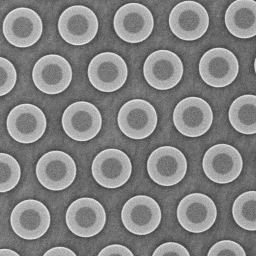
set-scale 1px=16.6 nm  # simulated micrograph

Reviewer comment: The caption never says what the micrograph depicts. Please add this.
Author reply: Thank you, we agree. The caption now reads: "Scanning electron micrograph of an array of small figures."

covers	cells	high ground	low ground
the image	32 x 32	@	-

----------------@-----@@@----@@@
-@@@----@@@@---@@@@--@@@@@--@@@@
-@@@@--@@@@@--@@@@@--@@@@@--@@@@
@@@@@--@@@@@--@@@@@--@@@@@--@@@@
-@@@@---@@@@---@@@@---@@@----@@@
--@@-----@----------------------
-------------------@@-----@@@---
@----@@@----@@@---@@@@---@@@@@--
@@--@@@@@--@@@@@--@@@@@--@@@@@--
@@--@@@@@--@@@@@--@@@@@--@@@@@--
@@--@@@@@---@@@----@@@----@@@---
@-----@@------------------------
-----------------@-----@@----@@@
--@@@---@@@@---@@@@---@@@@---@@@
-@@@@@--@@@@@--@@@@@--@@@@@--@@@
-@@@@@--@@@@@--@@@@@--@@@@---@@@
-@@@@---@@@@---@@@@----@@@----@@
--@@@-----@---------------------
--------------------@@----@@@---
@----@@@@---@@@@---@@@@---@@@@--
@@---@@@@---@@@@--@@@@@--@@@@@--
@@---@@@@---@@@@---@@@@---@@@@--
@@---@@@@---@@@@---@@@@---@@@---
@@----@@------------------------
-----------------------@@@----@@
--@@@----@@@----@@@@--@@@@@--@@@
--@@@@--@@@@@--@@@@@--@@@@@--@@@
-@@@@@--@@@@@--@@@@@--@@@@@--@@@
--@@@@---@@@@---@@@----@@@----@@
--@@@-----@---------------------
---------------------@-----@@@--
@@----@@@----@@@---@@@@---@@@@@-